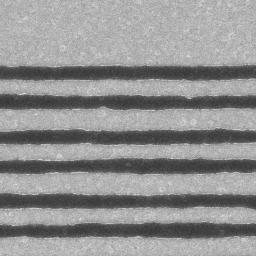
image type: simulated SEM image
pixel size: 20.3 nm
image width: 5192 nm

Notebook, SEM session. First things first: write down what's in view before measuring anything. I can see parallel lines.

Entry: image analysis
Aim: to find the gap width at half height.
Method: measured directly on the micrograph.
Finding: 307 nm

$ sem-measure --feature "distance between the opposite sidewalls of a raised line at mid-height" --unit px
14.6